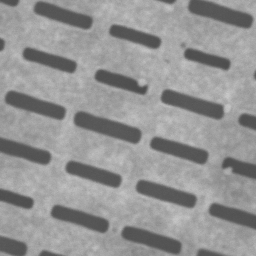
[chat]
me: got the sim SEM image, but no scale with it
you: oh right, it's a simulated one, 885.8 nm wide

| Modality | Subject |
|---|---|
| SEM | a regular array of holes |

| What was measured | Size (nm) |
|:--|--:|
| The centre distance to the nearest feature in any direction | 164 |